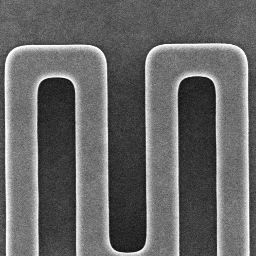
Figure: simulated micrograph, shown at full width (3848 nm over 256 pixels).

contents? groups of lines, slits or small figures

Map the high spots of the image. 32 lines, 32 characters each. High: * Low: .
................................
................................
................................
................................
................................
.........................***....
.************......***********..
.************.....*************.
.************.....*************.
.************.....******.******.
.****....****.....****.....****.
.****....****.....****.....****.
.****....****.....****.....****.
.****....****.....****.....****.
.****....****.....****.....****.
.****....****.....****.....****.
.****....****.....****.....****.
.****.....***.....****.....****.
.****.....***.....****.....****.
.****.....***.....****.....****.
.****.....***.....****.....****.
.****.....***.....****.....****.
.****.....***.....****.....****.
.****.....***.....****.....****.
.****.....***.....****.....****.
.****.....***.....****.....****.
.****.....***.....****.....****.
.****.....***.....****.....****.
.****.....***.....****.....****.
.****.....****....****.....****.
.****.....****....****.....****.
.****.....*****..*****.....****.